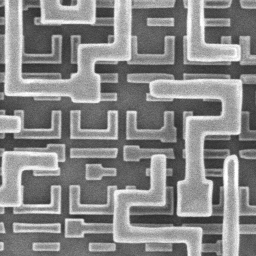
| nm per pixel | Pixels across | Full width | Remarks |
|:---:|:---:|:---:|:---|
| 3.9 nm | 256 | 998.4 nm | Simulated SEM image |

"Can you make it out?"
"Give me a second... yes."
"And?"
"wiring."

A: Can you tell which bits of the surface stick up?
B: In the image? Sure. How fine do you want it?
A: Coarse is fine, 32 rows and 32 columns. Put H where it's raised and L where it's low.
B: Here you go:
LHHLLHHHLHHHLLHHLLLLLLLLHLLLLLLL
LHHLLHHHHHHHLLHHLLLLLLLLHLLLLLLL
LHHLLHHHHHHHLLHHLLLLLLLHHLLLLLLL
LHHLLLLLLLLLLLHHLLLLLLLHHLLLLLLL
LHHLLLLLLLLLLLHHLLLLLLLHHLLLLLLL
LHHLLLLLLLLLLLHHLLLLLLLHHHLLLLLL
LHHLLLLLLLHHHHHHLLLLLLLHHHHHHHLL
LHHLLLLLLLHHHHHHLLLLLLLLHHHHHHLL
LHHLLLLLLLHHLLLLLLLLLLLLLLLLLLLL
LHHLLLLLLHHHLLLLLLLLLLLLLLLLLLLL
LHHHHHHHHHHHLLLLLLLHHHHHHHHHHHLL
LHHHHHHHHHHHLLLLLLLHHHHHHHHHHHLL
LLLLLLLLLHHHLLLLLLLLLLLLLLLHHHLL
LLLLLLLLLLLLLLLLLLLLLLLLLLLLHHLL
LLLLLLLLLLLLLLLLLLLLLLLLLLLHHHLL
HHHLLLLLLLLLLLLLLLLLLLLHHHHHHHLL
HHLLLLLLLLLLLLLLLLLLLLLHHHHHHHLL
LLLLLLLLLLLLLLLLLLLLLLLHHLLLLLLL
LLLLLLLLLLLLLLLLLLLLLLLHHLLLLLLL
HHHHHHHLLLLLLLLLLLLHHLLHHLLLLLLL
HHHHHHHLLLLLLLLLLLLHHLLHHLLLHHLL
HHHLLLLLLLLLLLLLLLLHHLLHHHLLHHLL
HHHLLLLLLLLLLLLLLLLHHLLHHHLLHHLL
HHHLLLLLLLLLLLLLLLLHHLHHHHHLHHLL
HHHLLLLLLLLLLLHHHHHHHLHHHHLLHHLL
HHLLLLLLLLLLLLHHHHHHLLHHHHLLHHLL
LLLLLLLLLLLLLLHHLLLLLLHHHHLLHHLL
LLLLLLLLLLLLLLHHLLLLLLLLLLLLHHLL
LLLLLLLLLLLLLLHHHHHHHHHHHLLLHHLL
LLLLLLLLLLLLLLHHHHHHHHHHHLLLHHLL
LLLLLLLLLLLLLLLLLLLLLLLHHLLLHHLL
LLLLLLLLLLLLLLLLLLLLLLLHHLLLHHLL